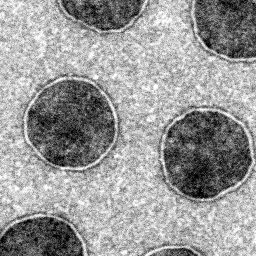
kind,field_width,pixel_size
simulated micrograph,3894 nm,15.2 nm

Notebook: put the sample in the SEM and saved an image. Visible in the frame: raised bodies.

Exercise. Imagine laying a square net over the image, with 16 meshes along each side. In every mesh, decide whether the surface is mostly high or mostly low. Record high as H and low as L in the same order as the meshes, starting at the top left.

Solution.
LLLLHHHHHLLLHHHH
LLLLLHHHLLLLHHHH
LLLLLLLLLLLLHHHH
LLLLLLLLLLLLLLHH
LLLLLLLLLLLLLLLL
LLLHHHLLLLLLLLLL
LLHHHHHLLLLLLLLL
LLHHHHHLLLLHHHHL
LLHHHHHLLLHHHHHH
LLHHHHHLLLHHHHHH
LLLLHLLLLLHHHHHH
LLLLLLLLLLLHHHHL
LLLLLLLLLLLLLLLL
LLHLLLLLLLLLLLLL
HHHHHLLLLLLLLLLL
HHHHHLLLLLHHLLLL